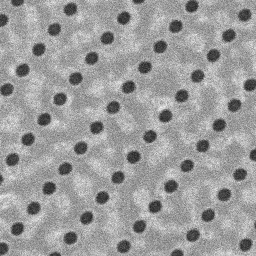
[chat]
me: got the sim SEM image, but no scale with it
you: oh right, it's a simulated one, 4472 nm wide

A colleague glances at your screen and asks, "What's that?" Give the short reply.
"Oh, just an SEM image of a regular array of holes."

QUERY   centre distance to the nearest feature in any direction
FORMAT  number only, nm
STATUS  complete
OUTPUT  446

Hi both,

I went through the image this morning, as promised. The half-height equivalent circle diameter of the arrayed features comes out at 0.252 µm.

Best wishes